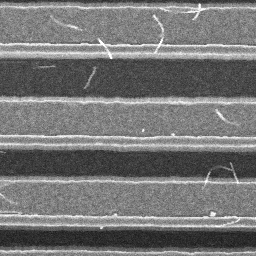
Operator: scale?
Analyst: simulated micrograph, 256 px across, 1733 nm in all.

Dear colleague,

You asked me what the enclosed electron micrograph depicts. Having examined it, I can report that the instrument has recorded lines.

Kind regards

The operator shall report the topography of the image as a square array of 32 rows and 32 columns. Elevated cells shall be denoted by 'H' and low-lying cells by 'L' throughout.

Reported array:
LLLLLLLLLLLLLLLLLLLLLLLLLLLLLLLL
HHHHHHHHHHHHHHHHHHHHHHHHHHHHHHHH
HHHHHHHHHHHHHHHHHHHHHHHHHHHHHHHH
HHHHHHHHHHHHHHHHHHHHHHHHHHHHHHHH
HHHHHHHHHHHHHHHHHHHHHHHHHHHHHHHH
HHHHHHHHHHHHHHHHHHHHHHHHHHHHHHHH
HHHHHHHHHHHHHHHHHHHHHHHHHHHHHHHH
LLLLLLLLLLLLLLLLLLLLLLLLLLLLLLLL
LLLLLLLLLLLLLLLLLLLLLLLLLLLLLLLL
LLLLLLLLLLLLLLLLLLLLLLLLLLLLLLLL
LLLLLLLLLLLLLLLLLLLLLLLLLLLLLLLL
LLLLLLLLLLLLLLLLLLLLLLLLLLLLLLLL
LLLLLLLLLLLLLLLLLLLLLLLLLLLLLLLL
HHHHHHHHHHHHHHHHHHHHHHHHHHHHHHHH
HHHHHHHHHHHHHHHHHHHHHHHHHHHHHHHH
HHHHHHHHHHHHHHHHHHHHHHHHHHHHHHHH
HHHHHHHHHHHHHHHHHHHHHHHHHHHHHHHH
HHHHHHHHHHHHHHHHHHHHHHHHHHHHHHHH
LLLLLLLLLLLLLLLLLLLLLLLLLLLLLLLL
LLLLLLLLLLLLLLLLLLLLLLLLLLLLLLLL
LLLLLLLLLLLLLLLLLLLLLLLLLLLLLLLL
LLLLLLLLLLLLLLLLLLLLLLLLLLLLLLLL
HLLHHLLLLLLLHLLLLLLLLLLLLLLLLLLL
HHHHHHHHHHHHHHHHHHHHHHHHHHHHHHHH
HHHHHHHHHHHHHHHHHHHHHHHHHHHHHHHH
HHHHHHHHHHHHHHHHHHHHHHHHHHHHHHHH
HHHHHHHHHHHHHHHHHHHHHHHHHHHHHHHH
HHHHHHHHHHHHHHHHHHHHHHHHHHHHHHHH
LLLLLLLLLLLLLLLLLLLLLLLLLLLLLLLL
LLLLLLLLLLLLLLLLLLLLLLLLLLLLLLLL
LLLLLLLLLLLLLLLLLLLLLLLLLLLLLLLL
HHHHHHHHHHHHHHHHHHHHHHHHHHHHLLHH